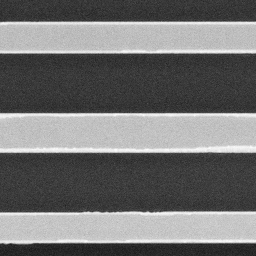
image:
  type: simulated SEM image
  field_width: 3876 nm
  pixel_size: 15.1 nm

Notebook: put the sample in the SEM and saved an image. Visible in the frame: lines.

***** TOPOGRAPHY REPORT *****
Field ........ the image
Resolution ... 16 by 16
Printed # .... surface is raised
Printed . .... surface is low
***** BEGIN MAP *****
................
################
################
................
................
................
................
################
################
................
................
................
................
################
################
................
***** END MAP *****